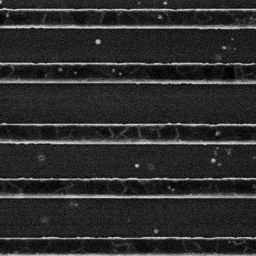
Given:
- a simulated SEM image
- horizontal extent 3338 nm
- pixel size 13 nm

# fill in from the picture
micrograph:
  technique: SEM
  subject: lines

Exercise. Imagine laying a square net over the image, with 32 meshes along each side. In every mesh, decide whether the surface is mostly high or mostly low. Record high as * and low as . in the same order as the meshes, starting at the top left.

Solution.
................................
********************************
********************************
................................
................................
................................
................................
................................
********************************
********************************
................................
................................
................................
................................
................................
*....................*..........
********************************
********************************
................................
................................
................................
................................
********************************
********************************
********************************
................................
................................
................................
................................
................................
********************************
********************************